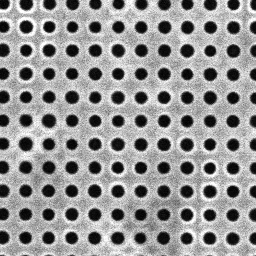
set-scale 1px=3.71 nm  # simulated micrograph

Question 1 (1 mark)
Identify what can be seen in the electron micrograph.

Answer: a regular array of holes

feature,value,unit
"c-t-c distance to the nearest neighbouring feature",22.9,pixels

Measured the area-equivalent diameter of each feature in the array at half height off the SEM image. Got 45.4 nm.